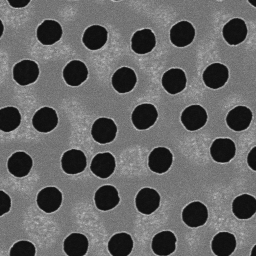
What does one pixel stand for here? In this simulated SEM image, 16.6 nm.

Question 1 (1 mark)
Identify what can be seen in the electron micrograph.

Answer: a regular array of holes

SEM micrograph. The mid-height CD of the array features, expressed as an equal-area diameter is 25.8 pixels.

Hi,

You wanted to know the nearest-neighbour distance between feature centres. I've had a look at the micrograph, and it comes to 41.5 pixels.